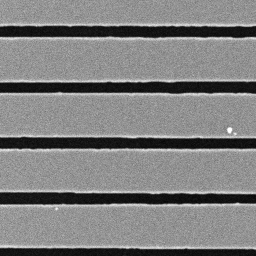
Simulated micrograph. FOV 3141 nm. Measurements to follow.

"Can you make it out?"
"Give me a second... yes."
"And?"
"lines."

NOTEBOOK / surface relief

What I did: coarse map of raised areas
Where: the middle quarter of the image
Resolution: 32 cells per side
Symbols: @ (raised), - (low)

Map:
@@@@@@@@@@@@@@@@@@@@@@@@@@@@@@@@
@@@@@@@@@@@@@@@@@@@@@@@@@@@@@@@@
@@@@@@@@@@@@@@@@@@@@@@@@@@@@@@@@
@@@@@@@@@@@@@@@@@@@@@@@@@@@@@@@@
--------------------------------
--------------------------------
--------------------------------
@@@@@@@@@@@@@@@@@@@@@@@@@@@--@@@
@@@@@@@@@@@@@@@@@@@@@@@@@@@@@@@@
@@@@@@@@@@@@@@@@@@@@@@@@@@@@@@@@
@@@@@@@@@@@@@@@@@@@@@@@@@@@@@@@@
@@@@@@@@@@@@@@@@@@@@@@@@@@@@@@@@
@@@@@@@@@@@@@@@@@@@@@@@@@@@@@@@@
@@@@@@@@@@@@@@@@@@@@@@@@@@@@@@@@
@@@@@@@@@@@@@@@@@@@@@@@@@@@@@@@@
@@@@@@@@@@@@@@@@@@@@@@@@@@@@@@@@
@@@@@@@@@@@@@@@@@@@@@@@@@@@@@@@@
@@@@@@@@@@@@@@@@@@@@@@@@@@@@@@@@
--------------------------------
--------------------------------
--------------------------------
@@@@@@@@@@@@@@@@@@@@@@@@@@@@@@@@
@@@@@@@@@@@@@@@@@@@@@@@@@@@@@@@@
@@@@@@@@@@@@@@@@@@@@@@@@@@@@@@@@
@@@@@@@@@@@@@@@@@@@@@@@@@@@@@@@@
@@@@@@@@@@@@@@@@@@@@@@@@@@@@@@@@
@@@@@@@@@@@@@@@@@@@@@@@@@@@@@@@@
@@@@@@@@@@@@@@@@@@@@@@@@@@@@@@@@
@@@@@@@@@@@@@@@@@@@@@@@@@@@@@@@@
@@@@@@@@@@@@@@@@@@@@@@@@@@@@@@@@
@@@@@@@@@@@@@@@@@@@@@@@@@@@@@@@@
@@@@@@@@@@@@@@@@@@@@@@@@@@@@@@@@